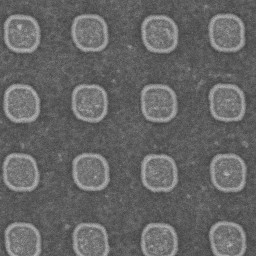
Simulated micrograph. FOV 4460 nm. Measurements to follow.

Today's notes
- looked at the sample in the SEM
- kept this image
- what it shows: a regular array of raised bodies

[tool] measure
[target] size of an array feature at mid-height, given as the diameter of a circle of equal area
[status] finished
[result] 617 nanometres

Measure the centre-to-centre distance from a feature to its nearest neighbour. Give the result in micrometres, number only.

1.19